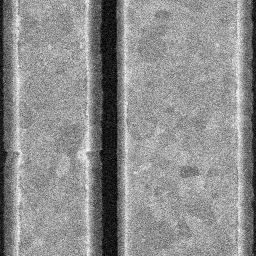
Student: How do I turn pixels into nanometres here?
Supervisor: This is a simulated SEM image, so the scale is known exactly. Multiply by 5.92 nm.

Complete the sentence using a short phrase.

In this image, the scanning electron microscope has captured one or a few lines or trenches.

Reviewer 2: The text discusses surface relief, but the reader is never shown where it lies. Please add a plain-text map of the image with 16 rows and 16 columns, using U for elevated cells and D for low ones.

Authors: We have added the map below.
DUUUUUDDUUUUUUUD
DUUUUUDDUUUUUUUD
DUUUUUDDUUUUUUUD
DUUUUUDDUUUUUUUD
DUUUUUDDUUUUUUUD
DUUUUUDDUUUUUUUD
DUUUUUDDUUUUUUUD
DUUUUUDDUUUUUUUD
DUUUUUDDUUUUUUUD
DUUUUUDDUUUUUUUD
DUUUUUDDUUUUUUUD
DUUUUUDDUUUUUUUD
DUUUUUDDUUUUUUUD
DUUUUUDDUUUUUUUD
DUUUUUDDUUUUUUUD
DUUUUUDDUUUUUUUD